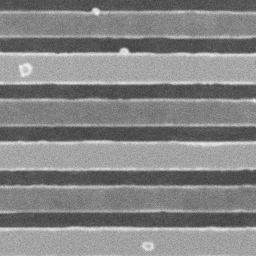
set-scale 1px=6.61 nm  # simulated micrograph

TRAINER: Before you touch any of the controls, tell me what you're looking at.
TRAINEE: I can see lines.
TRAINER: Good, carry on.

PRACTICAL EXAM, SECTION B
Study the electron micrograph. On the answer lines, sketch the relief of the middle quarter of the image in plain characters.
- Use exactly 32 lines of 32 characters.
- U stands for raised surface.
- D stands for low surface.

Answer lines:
UUUUUUUUUUUUUUUUUUUUUUUUUUUUUUUU
UUUUUUUUUUUUUUUUUUUUUUUUUUUUUUUU
UUUUUUUUUUUUUUUUUUUUUUUUUUUUUUUU
UUUUUUUUUUUUUUUUUUUUUUUUUUUUUUUU
UUUUUUUUUUUUUUUUUUUUUUUUUUUUUUUU
DDDDDDDDDDDDDDDDDDDDDDDDDDDDDDDD
DDDDDDDDDDDDDDDDDDDDDDDDDDDDDDDD
DDDDDDDDDDDDDDDDDDDDDDDDDDDDDDDD
DDDDDDDDDDDDDDDDDDDDDDDDDDDDDDDD
UUUUUUUUUUUUUUUUUUUUUUUUUUUUUUUU
UUUUUUUUUUUUUUUUUUUUUUUUUUUUUUUU
UUUUUUUUUUUUUUUUUUUUUUUUUUUUUUUU
UUUUUUUUUUUUUUUUUUUUUUUUUUUUUUUU
UUUUUUUUUUUUUUUUUUUUUUUUUUUUUUUU
UUUUUUUUUUUUUUUUUUUUUUUUUUUUUUUU
DDDDDDDDDDDDDDDDDDDDDDDDDDDDDDDD
DDDDDDDDDDDDDDDDDDDDDDDDDDDDDDDD
DDDDDDDDDDDDDDDDDDDDDDDDDDDDDDDD
DDDDDDDDDDDDDDDDDDDDDDDDDDDDDDDD
DDDDUUUUUUUUDDDDDDDDDDDDDDUUUDDD
UUUUUUUUUUUUUUUUUUUUUUUUUUUUUUUU
UUUUUUUUUUUUUUUUUUUUUUUUUUUUUUUU
UUUUUUUUUUUUUUUUUUUUUUUUUUUUUUUU
UUUUUUUUUUUUUUUUUUUUUUUUUUUUUUUU
UUUUUUUUUUUUUUUUUUUUUUUUUUUUUUUU
UUUUUUUUUUUUUUUUUUUUUUUUUUUUUUUU
UDDDDDDDDDDDDDDDDDDDDDDDDDDDDDDD
DDDDDDDDDDDDDDDDDDDDDDDDDDDDDDDD
DDDDDDDDDDDDDDDDDDDDDDDDDDDDDDDD
DDDDDDDDDDDDDDDDDDDDDDDDDDDDDDDD
DDDDDDDDDDDDDDDDDDDDDDDDDDDDDDDD
UUUUUUUUUUUUUUUUUUUUUUUUUUUUUUUU